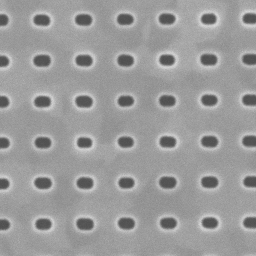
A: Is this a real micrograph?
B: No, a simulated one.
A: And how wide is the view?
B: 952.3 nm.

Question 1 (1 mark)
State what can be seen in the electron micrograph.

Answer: a regular array of holes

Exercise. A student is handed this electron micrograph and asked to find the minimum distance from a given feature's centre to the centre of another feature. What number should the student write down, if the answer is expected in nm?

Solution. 151